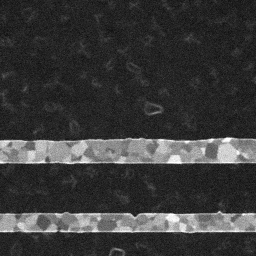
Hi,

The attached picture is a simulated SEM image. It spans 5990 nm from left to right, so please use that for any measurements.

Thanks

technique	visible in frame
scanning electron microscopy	one or a few lines or trenches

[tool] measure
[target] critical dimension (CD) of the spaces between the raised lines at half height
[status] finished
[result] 51 pixels